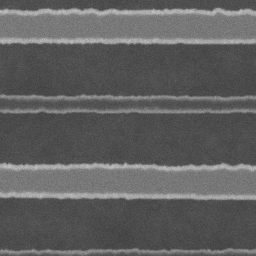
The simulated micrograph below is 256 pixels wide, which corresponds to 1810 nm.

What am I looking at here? lines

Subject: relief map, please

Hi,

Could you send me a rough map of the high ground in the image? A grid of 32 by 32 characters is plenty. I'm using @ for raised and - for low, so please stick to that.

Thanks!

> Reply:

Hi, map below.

--------------------------------
@@@@@@@@@@@@@@@@@@@@@@@@@@@@@@@@
@@@@@@@@@@@@@@@@@@@@@@@@@@@@@@@@
@@@@@@@@@@@@@@@@@@@@@@@@@@@@@@@@
@@@@@@@@@@@@@@@@@@@@@@@@@@@@@@@@
--------------------------------
--------------------------------
--------------------------------
--------------------------------
--------------------------------
--------------------------------
--------------------------------
@@@@@@@@@@@@@@@@@@@@@@@@@@@@@@@@
@@@@@@@@@@@@@@@@@@@@@@@@@@@@@@@@
--------------------------------
--------------------------------
--------------------------------
--------------------------------
--------------------------------
--------------------------------
--------------------------------
@@@@@@@@@@@@@@@@@@@@@@@@@@@@@@@@
@@@@@@@@@@@@@@@@@@@@@@@@@@@@@@@@
@@@@@@@@@@@@@@@@@@@@@@@@@@@@@@@@
@@@@@@@@@@@@@@@@@@@@@@@@@@@@@@@@
--------------------------------
--------------------------------
--------------------------------
--------------------------------
--------------------------------
--------------------------------
@@@@@@@@@@@@@@@@@@@@@@@@@@@@@@@@